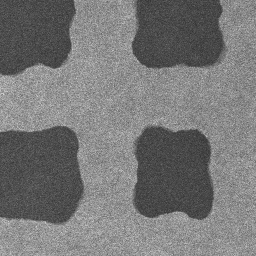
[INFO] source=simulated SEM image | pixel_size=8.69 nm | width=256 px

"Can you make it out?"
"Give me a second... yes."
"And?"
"holes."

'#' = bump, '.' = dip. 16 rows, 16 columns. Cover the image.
.....###......##
....####......##
....####......##
....####......##
.###############
################
################
################
.....####....###
.....###.....###
.....####....###
.....###.....###
.....###.....###
.....####.##.###
################
################